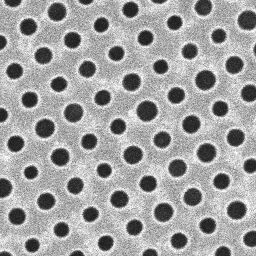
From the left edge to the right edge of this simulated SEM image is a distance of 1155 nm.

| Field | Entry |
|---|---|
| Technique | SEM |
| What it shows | a regular array of holes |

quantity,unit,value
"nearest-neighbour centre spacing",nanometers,146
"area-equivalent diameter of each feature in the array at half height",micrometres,0.0726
